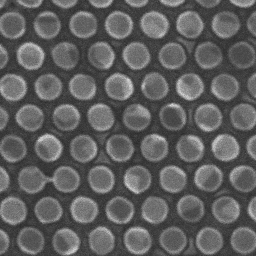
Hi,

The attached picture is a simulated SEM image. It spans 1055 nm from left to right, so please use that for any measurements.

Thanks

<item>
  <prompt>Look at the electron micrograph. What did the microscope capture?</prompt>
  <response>a regular array of raised bodies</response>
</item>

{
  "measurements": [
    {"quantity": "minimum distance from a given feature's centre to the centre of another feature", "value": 0.144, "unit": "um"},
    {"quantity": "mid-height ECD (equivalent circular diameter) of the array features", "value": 0.107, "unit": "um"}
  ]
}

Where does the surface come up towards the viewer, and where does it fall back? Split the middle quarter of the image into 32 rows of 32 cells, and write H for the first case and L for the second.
HHLLLLLLHHHLLLLLHHHHLLLLLHHHHLLL
LLLLLLLLLLLLLLLLLLLLLLLLLLLLLLLL
LLLLLLLLLLLLLLLLLLLLLHHHLLLLLLHH
LLHHHHHLLLLHHHHHLLLLHHHHHLLLLHHH
LHHHHHHHLLHHHHHHHLLLHHHHHHLLLHHH
LHHHHHHHLLHHHHHHHLLLHHHHHHLLHHHH
LLHHHHHHLLLHHHHHHLLLHHHHHHLLLHHH
LLHHHHHLLLLHHHHHHLLLHHHHHLLLLHHH
LLLLHHLLLLLLHHHHLLLLLHHHLLLLLLHH
LLLLLLLLLLLLLLLLLLLLLLLLLLLLLLLL
HHLLLLLLHHLLLLLLLLLLLLLLLLHHHLLL
HHHLLLHHHHHHLLLHHHHHLLLLHHHHHHLL
HHHHLLHHHHHHLLLHHHHHHLLLHHHHHHLL
HHHHLLHHHHHHLLLHHHHHHLLLHHHHHHLL
HHHLLLHHHHHHLLLHHHHHHLLLHHHHHHLL
HHHLLLLHHHHHLLLLHHHHHLLLLHHHHHLL
LLLLLLLLLLLLLLLLLLHLLLLLLLLHHLLL
LLLLLLLLLLLLLLLLLLLLLLLLLLLLLLLL
LLLHHHLLLLLLHHHHLLLLHHHHHLLLLLHH
LLHHHHHLLLLHHHHHHLLLHHHHHHLLLHHH
LLHHHHHHLLLHHHHHHLLHHHHHHHLLHHHH
LLHHHHHHLLLHHHHHHLLHHHHHHHLLLHHH
LLHHHHHHLLLHHHHHHLLLHHHHHLLLLHHH
LLHHHHHLLLLLHHHHLLLLLHHHLLLLLLHH
LLLLLLLLLLLLLLLLLLLLLLLLLLLLLLLL
LLLLLLLLLLLLLLLLLLHLLLLLLLLLLLLL
HHHLLLLHHHHLLLLLHHHHHLLLLHHHHLLL
HHHHLLHHHHHHLLLHHHHHHLLLHHHHHHLL
HHHHLLHHHHHHLLLHHHHHHHLLHHHHHHLL
HHHHLLHHHHHHLLLHHHHHHHLLHHHHHHLL
HHHLLLLHHHHHLLLHHHHHHLLLHHHHHHLL
HHHLLLLHHHHHLLLLLHHHLLLLLHHHHLLL